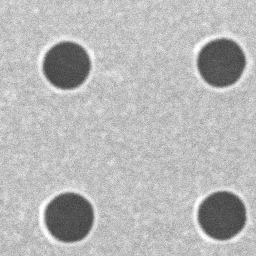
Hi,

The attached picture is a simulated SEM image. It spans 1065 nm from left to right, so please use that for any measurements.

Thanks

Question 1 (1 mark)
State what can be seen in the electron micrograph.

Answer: holes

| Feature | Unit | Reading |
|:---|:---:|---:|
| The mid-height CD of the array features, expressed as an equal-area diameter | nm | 209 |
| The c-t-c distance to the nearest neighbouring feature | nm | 635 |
